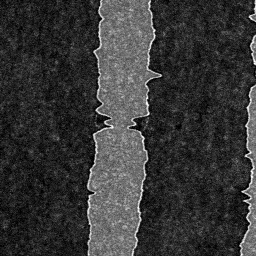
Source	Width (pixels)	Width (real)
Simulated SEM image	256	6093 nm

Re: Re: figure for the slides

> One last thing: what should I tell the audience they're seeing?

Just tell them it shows one or a few lines or trenches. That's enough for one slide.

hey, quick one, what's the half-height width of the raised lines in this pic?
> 1180 nm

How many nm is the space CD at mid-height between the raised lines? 2520